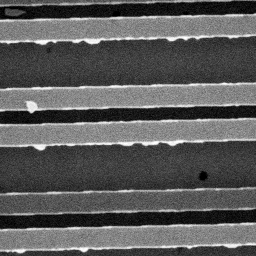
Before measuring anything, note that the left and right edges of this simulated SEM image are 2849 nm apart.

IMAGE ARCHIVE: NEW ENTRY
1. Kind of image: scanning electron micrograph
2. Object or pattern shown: lines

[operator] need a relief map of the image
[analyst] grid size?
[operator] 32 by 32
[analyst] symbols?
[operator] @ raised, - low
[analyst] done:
@@@@@@@@@@@@--------------------
--------------------------------
----@@@@@@@@@@@@@@@@@@@@@@@@@@@@
@@@@@@@@@@@@@@@@@@@@@@@@@@@@@@@@
@@@@@@@@@@@@@@@@@@@@@@@@@@@-----
--------------------------------
--------------------------------
--------------------------------
--------------------------------
--------------------------------
---------------------------@@@@@
@@@@@@@@@@@@@@@@@@@@@@@@@@@@@@@@
@@@@@@@@@@@@@@@@@@@@@@@@@@@@@@@@
@@@@@@@@@@@@@@------------------
--------------------------------
---------@@@@@@@@@@@@@@@@@@@@@@@
@@@@@@@@@@@@@@@@@@@@@@@@@@@@@@@@
@@@@@@@@@@@@@@@@@@@@@@@@@@@@@---
--------------------------------
--------------------------------
--------------------------------
--------------------------------
--------------------------------
--------------------------------
@@@@@@@@@@@@@@@@@@@@@@@@@@@@@@@@
@@@@@@@@@@@@@@@@@@@@@@@@@@@@@@@@
@@@@@@@@@@@@@-------------------
--------------------------------
--------@@@@@@@@@@@@@@@@@@@@@@@@
@@@@@@@@@@@@@@@@@@@@@@@@@@@@@@@@
@@@@@@@@@@@@@@@@@@@@@@@@@@@@@@@@
--------------------------------